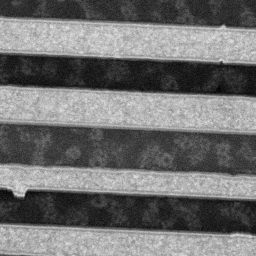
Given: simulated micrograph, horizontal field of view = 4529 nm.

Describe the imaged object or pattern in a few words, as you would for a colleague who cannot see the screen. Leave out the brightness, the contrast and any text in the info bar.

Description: one or a few lines or trenches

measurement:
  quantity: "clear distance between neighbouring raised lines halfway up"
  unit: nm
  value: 630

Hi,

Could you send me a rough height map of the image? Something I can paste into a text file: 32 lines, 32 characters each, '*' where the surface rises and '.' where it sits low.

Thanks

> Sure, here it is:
................................
................................
******..........................
****************************....
********************************
********************************
********************************
....................************
................................
................................
................................
****************.*..............
********************************
********************************
********************************
........************************
..............................**
................................
................................
................................
................................
******************.*............
********************************
.*******************************
..*....................*********
................................
................................
................................
***********.....................
********************************
********************************
********************************